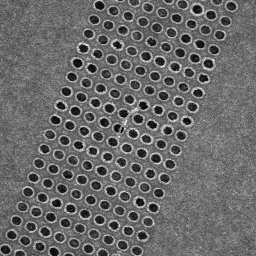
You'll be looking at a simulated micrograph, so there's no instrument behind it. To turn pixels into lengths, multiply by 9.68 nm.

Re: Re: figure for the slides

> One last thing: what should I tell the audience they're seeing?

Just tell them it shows a regular array of holes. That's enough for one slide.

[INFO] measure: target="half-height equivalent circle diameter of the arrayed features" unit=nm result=94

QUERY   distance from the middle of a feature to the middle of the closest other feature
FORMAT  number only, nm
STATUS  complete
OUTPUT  145